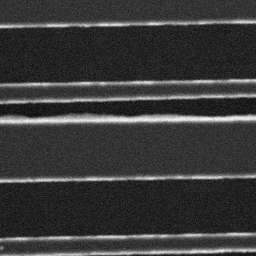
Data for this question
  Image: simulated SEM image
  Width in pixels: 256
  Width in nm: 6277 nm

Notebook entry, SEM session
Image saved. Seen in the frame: lines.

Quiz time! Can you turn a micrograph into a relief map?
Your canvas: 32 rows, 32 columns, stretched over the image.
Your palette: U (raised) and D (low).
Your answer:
UUUUUUUUUUUUUUUUUUUUUUUUUUUUUUUU
UUUUUUUUUUUUUUUUUUUUUUUUUUUUUUUU
UUUUUUUUUUUUUUUUUUUUUUUUUUUUUUUU
DDDDDDDDDDDDDDDDDDDDDDDDDDDDDDDD
DDDDDDDDDDDDDDDDDDDDDDDDDDDDDDDD
DDDDDDDDDDDDDDDDDDDDDDDDDDDDDDDD
DDDDDDDDDDDDDDDDDDDDDDDDDDDDDDDD
DDDDDDDDDDDDDDDDDDDDDDDDDDDDDDDD
DDDDDDDDDDDDDDDDDDDDDDDDDDDDDDDD
DDDDDDDDDDDDDDDDDDDDDDDDDDDDDDDD
DDDDUUUUUUUUUUUUUUUUUUUUUUUUUUUU
UUUUUUUUUUUUUUUUUUUUUUUUUUUUUUUU
UUUUUUUUUUUUUDDDDDDDDDDDDDDDDDDD
DDDDDDDDDDDDDDDDDDDDDDDDDDDDDDDD
DDDDDDDDDDDDDDDDDDDDDDDDDDDDDDDD
UUUUUUUUUUUUUUUUUUUUUUUUUUUUUUUU
UUUUUUUUUUUUUUUUUUUUUUUUUUUUUUUU
UUUUUUUUUUUUUUUUUUUUUUUUUUUUUUUU
UUUUUUUUUUUUUUUUUUUUUUUUUUUUUUUU
UUUUUUUUUUUUUUUUUUUUUUUUUUUUUUUU
UUUUUUUUUUUUUUUUUUUUUUUUUUUUUUUU
UUUUUUUUUUUUUUUUUUUUUUUUUUUUUUUU
UUUUUDDDDDDDDDDDDDDDDDDDDDDDDDDD
DDDDDDDDDDDDDDDDDDDDDDDDDDDDDDDD
DDDDDDDDDDDDDDDDDDDDDDDDDDDDDDDD
DDDDDDDDDDDDDDDDDDDDDDDDDDDDDDDD
DDDDDDDDDDDDDDDDDDDDDDDDDDDDDDDD
DDDDDDDDDDDDDDDDDDDDDDDDDDDDDDDD
DDDDDDDDDDDDDDDDDDDDDDDDDDDDDDDD
DDDDDDDDDDDDDDDDDDDUUUUUUUUUUUUU
UUUUUUUUUUUUUUUUUUUUUUUUUUUUUUUU
UUUUUUUUUUUUUUUUUUUUUUUUUUDDDDDD